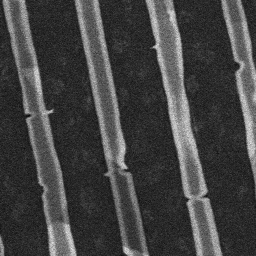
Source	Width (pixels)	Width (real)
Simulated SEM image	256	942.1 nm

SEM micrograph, one or a few lines or trenches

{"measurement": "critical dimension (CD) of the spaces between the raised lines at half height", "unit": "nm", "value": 195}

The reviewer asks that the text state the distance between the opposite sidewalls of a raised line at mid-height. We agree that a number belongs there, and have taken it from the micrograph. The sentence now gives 0.065 um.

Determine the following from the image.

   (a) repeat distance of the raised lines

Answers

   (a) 260 nm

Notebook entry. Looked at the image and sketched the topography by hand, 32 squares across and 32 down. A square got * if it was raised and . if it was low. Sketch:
.**.......**.......**.......**..
.**.......**.......***......**..
.**.......**.......***......***.
.**.......***......***.......**.
..**......***......***.......**.
..**.......**......***.......**.
..**.......**.......***......**.
..**.......**.......***.......*.
..***......***......***.......**
..***......***......***.......**
...**.......**.......**.......**
...**.......**.......**.......**
...**.......**.......**.......**
...**.......***......**.......**
....**......***......**........*
....**.......**.......*........*
....**.......**.......**.......*
....**.......**.......**.......*
....***......**.......**.......*
....***......**........**......*
.....**.......*........**.......
.....**.......**.......**.......
.....***......**.......**.......
.....***......**.......***......
.....***......***......**.......
......**.......**.......**......
......**.......**.......**......
......**.......**.......**......
......***......***......***.....
......***......***.......**.....
......***.......**.......**.....
......***.......**.......**.....